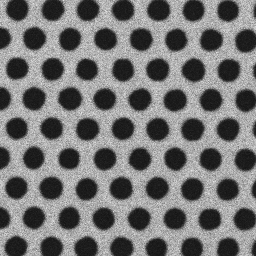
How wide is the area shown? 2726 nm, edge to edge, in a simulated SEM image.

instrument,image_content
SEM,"a regular array of holes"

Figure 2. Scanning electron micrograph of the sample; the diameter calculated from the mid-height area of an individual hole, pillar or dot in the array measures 0.238 microns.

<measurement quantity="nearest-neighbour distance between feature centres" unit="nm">364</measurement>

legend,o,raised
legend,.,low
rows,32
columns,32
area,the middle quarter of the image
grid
ooo.....oooo.....oooo.....oooo..
ooo.....oooo.....oooo.....ooo...
ooo.....oooo.....oooo.....oooo..
oooo....ooooo....oooo.....ooooo.
oooooooooooooo.ooooooooooooooooo
oooooooooooooooooooooooooooooooo
...oooooo...oooooo...oooooo..ooo
....oooo.....oooo.....oooo....oo
....ooo......ooo......ooo......o
....ooo......ooo......ooo......o
....oooo....ooooo....oooo.....oo
..oooooooo.ooooooo..oooooo...ooo
oooooooooooooooooooooooooooooooo
ooooo..oooooooooooooooo.oooooooo
oooo....ooooo....oooo....ooooo..
ooo......ooo......ooo.....oooo..
ooo......ooo......oo......ooo...
ooo......ooo.....oooo.....oooo..
oooo....ooooo...ooooo....ooooo..
oooooooooooooooooooooooooooooooo
oooooooooooooooooooooooooooooooo
...oooooo...ooooo....ooooo...ooo
....oooo.....oooo....oooo.....oo
....oooo.....ooo......ooo......o
....oooo.....ooo......ooo.....oo
....oooo....ooooo....ooooo....oo
ooooooooo..ooooooo..ooooooo..ooo
oooooooooooooooooooooooooooooooo
ooooo.ooooooo..ooooooo...oooooo.
oooo....oooo.....oooo.....oooo..
ooo.....oooo.....oooo.....ooo...
ooo.....ooo......oooo.....ooo...